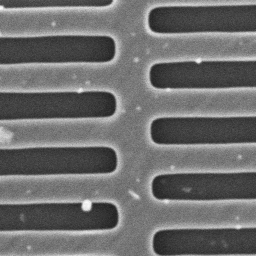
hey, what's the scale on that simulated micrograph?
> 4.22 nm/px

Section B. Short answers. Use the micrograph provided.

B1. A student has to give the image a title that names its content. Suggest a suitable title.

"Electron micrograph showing groups of lines, slits or small figures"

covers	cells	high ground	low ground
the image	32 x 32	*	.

..............*****************.
*******************.............
******************..............
*******************.............
****..........******************
..............******************
..............******************
..............******************
*******************.............
*******************.............
*******************.............
..............******************
...............*****************
...............*****************
..............********....**....
*******************.............
*******************.............
*******************.............
***...........******************
...............*****************
...............*****************
..............***********...*...
*******************.............
*******************.............
*******************.............
..........**..******************
...............*****************
...............*****************
..............**********.....*..
*******************.............
*******************.............
*******************.............